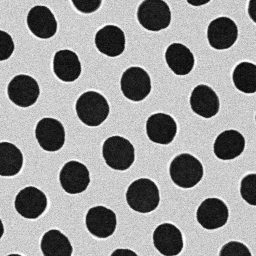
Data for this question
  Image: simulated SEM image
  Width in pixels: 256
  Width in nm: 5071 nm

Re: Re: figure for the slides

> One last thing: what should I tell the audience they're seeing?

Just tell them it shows a regular array of holes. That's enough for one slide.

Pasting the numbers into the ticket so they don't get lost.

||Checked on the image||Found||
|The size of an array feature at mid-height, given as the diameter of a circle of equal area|642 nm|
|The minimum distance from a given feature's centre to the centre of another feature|981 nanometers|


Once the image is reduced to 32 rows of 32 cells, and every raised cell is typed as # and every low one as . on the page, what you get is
#########....#####...###..#####.
####..####..#####....##########.
###....##########....######..###
####...######..###...#####....##
.####..#####....##########....##
..##########....#####..###...###
..#####..####..######...########
.######...###########...########
#######...######..###...#####...
##..###...#####....##########...
#....##########....##########...
#....######.###....#####...###..
#....#####...###..######...#####
#########.....##########...#####
##########...######..####..#####
#####...###..#####....##########
####....##########....######..##
#####...#####...###...#####....#
..###...#####....##########....#
...##########....#####..###...##
...#####..###....####....#######
..#####....##########....#######
#######....######..##....#####..
###..###...#####....###.######..
##....##########....##########..
##....##########....#####...###.
##...######...###..######....###
###########....##########...####
###########...######..####.#####
#####...####..#####....#########
#####....##########....#####..##
#####....#####...###..#####....#